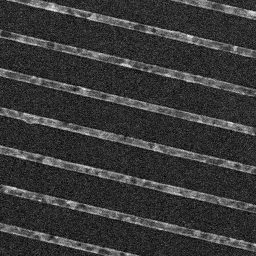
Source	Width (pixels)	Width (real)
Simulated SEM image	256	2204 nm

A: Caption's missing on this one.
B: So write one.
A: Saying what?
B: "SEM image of parallel lines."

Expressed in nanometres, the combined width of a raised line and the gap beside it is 325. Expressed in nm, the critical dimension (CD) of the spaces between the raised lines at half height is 265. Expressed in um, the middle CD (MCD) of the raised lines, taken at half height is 0.0598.